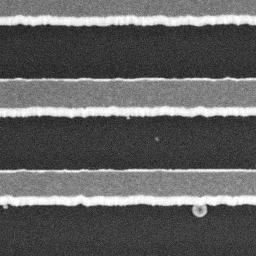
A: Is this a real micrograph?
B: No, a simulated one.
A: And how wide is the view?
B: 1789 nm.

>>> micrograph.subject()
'lines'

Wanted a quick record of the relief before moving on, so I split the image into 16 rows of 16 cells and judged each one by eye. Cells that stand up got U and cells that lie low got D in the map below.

UUUUUUUUUUUUUUUU
DDDDDDDDDDDDDDDD
DDDDDDDDDDDDDDDD
DDDDDDDDDDDDDDDD
DDDDDDDDDDDDDDDD
UUUUUUUUUUUUUUUU
UUUUUUUUUUUUUUUU
DDDDDDDDDDDDDDDD
DDDDDDDDDDDDDDDD
DDDDDDDDDDDDDDDD
DDDDDDDDDDDDDDDD
UUUUUUUUUUUUUUUU
UUUUUUUUUUUUUUUU
DDDDDDDDDDDDDDDD
DDDDDDDDDDDDDDDD
DDDDDDDDDDDDDDDD